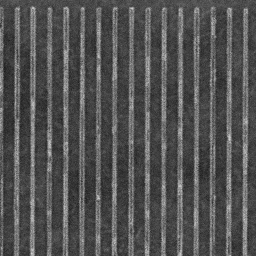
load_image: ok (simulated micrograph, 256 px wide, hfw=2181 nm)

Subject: parallel lines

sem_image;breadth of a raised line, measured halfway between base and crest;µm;0.0234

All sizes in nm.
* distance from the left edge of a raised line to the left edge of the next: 139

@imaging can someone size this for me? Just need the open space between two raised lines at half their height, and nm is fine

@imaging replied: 110